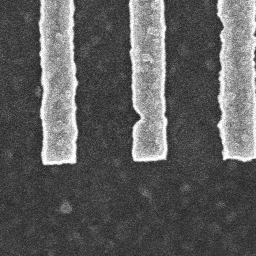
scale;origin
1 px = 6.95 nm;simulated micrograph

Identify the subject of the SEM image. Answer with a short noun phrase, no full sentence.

one or a few lines or trenches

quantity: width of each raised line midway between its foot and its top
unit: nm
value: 222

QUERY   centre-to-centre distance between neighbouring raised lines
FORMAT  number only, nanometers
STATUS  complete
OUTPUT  626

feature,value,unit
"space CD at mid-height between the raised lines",407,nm